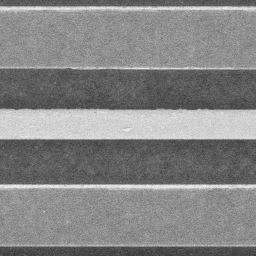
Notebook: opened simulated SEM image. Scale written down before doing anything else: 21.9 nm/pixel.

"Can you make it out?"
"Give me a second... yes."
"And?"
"lines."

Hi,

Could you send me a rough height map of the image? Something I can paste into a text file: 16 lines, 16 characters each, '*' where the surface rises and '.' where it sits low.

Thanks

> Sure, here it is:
****************
****************
****************
****************
................
................
................
................
................
................
................
................
****************
****************
****************
................